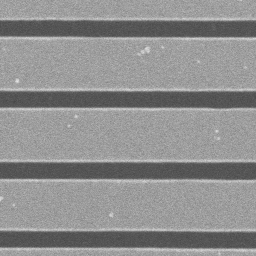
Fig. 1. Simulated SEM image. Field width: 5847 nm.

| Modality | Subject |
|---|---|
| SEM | lines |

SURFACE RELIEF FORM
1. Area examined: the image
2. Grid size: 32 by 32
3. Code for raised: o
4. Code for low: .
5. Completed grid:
oooooooooooooooooooooooooooooooo
oooooooooooooooooooooooooooooooo
....................oooooooooo..
................................
................................
oooooooooooooooooooooooooooooooo
oooooooooooooooooooooooooooooooo
oooooooooooooooooooooooooooooooo
oooooooooooooooooooooooooooooooo
oooooooooooooooooooooooooooooooo
oooooooooooooooooooooooooooooooo
................................
................................
................................
oooooooooooooooooooooooooooooooo
oooooooooooooooooooooooooooooooo
oooooooooooooooooooooooooooooooo
oooooooooooooooooooooooooooooooo
oooooooooooooooooooooooooooooooo
oooooooooooooooooooooooooooooooo
................................
................................
ooooooooooooooooooooooooooo.....
oooooooooooooooooooooooooooooooo
oooooooooooooooooooooooooooooooo
oooooooooooooooooooooooooooooooo
oooooooooooooooooooooooooooooooo
oooooooooooooooooooooooooooooooo
oooooooooooooooooooooooooooooooo
................................
................................
oooooooooooooooooooooooooooooooo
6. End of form